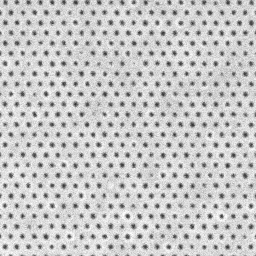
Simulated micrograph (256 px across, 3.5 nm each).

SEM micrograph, a regular array of holes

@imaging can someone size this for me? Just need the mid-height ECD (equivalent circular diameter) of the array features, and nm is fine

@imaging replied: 18.1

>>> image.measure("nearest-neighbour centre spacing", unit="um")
0.0397